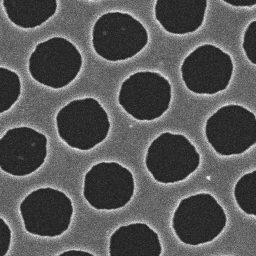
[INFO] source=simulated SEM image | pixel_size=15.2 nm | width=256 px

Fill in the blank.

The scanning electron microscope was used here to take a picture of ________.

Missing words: a regular array of holes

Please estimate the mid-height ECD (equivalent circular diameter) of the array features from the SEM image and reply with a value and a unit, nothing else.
777 nm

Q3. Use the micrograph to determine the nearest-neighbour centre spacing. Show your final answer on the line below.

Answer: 1020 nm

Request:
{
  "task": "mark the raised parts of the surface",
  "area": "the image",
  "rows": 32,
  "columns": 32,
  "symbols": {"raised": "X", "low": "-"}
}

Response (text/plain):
-------XXXXXXXXXXXX-------XXX---
X------XXXXXXXXXXXX-------XXXXXX
X-----XXXXXX-----XXX-----XXXXXXX
XXX-XXXXXXXX------XX-----XXXXXX-
XXXXXXXXXXXX------XXXXXXXXXXXXX-
XXXXX----XXX------XXXXXXXXXXXX--
XXXX------XX-----XXXXXXX----XXX-
XXXX------XXXX-XXXXXXXX------XX-
-XXX------XXXXXXXXXXXXX------XXX
--XX------XXXXXX----XXX------XXX
---XX---XXXXXXX------XX------XXX
---XXXXXXXXXXXX------XXX---XXXXX
--XXXXXXXX--XXX------XXXXXXXXXXX
-XXXXXXX-----XX------XXXXXXX---X
XXXXXXX------XXXX---XXXXXX------
XXXXXXX-------XXXXXXXXXXXX------
X----XX-------XXXXXXXXXXXX------
------XX-----XXXXXX-----XX------
------XXX--XXXXXXXX-----XXX----X
------XXXXXXXXXXXX-------XXXXXXX
-----XXXXXXX---XXX-------XXXXXXX
X---XXXXXXX-----XXX-----XXXXXXX-
XXXXXXXXXXX------XXX---XXXXXXX--
XXXXXXXXXXX------XXXXXXXXXXXX---
XXX-----XXX-----XXXXXXXX--XXX---
XXX------XX-----XXXXXX-----XXX--
XXX------XXXXXXXXXXXXX------XXX-
XXX------XXXXXXXXXXXXX------XXXX
-XX-----XXXXXXX----XXX------XXXX
-XXXX--XXXXXXX------XX-----XXXXX
-XXXXXXXXXXXXX------XXX--XXXXXXX
-XXXXXXX---XXX------XXXXXXXXXXXX